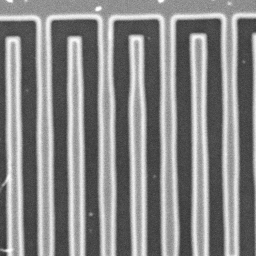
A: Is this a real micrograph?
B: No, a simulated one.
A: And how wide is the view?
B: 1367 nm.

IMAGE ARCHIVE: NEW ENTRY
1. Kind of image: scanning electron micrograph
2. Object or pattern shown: groups of lines, slits or small figures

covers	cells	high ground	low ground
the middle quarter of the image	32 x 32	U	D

DDUUDDDDDUUUDDDDDUUDDDDDDUUDDDDD
DDUUDDDDDUUUDDDDDUUDDDDDDUUDDDDD
DUUUDDDDDUUUDDDDDUUDDDDDDUUDDDDD
DUUUDDDDDUUUDDDDDUUDDDDDDUUDDDDD
DUUUDDDDDUUUDDDDDUUUDDDDDUUDDDDD
DUUUDDDDDUUUDDDDDUUUDDDDDUUDDDDD
DUUUDDDDDUUUDDDDDUUUDDDDDUUDDDDD
DUUUDDDDDUUUDDDDDUUUDDDDDUUUDDDD
DUUUDDDDDUUUDDDDDUUUDDDDDUUUDDDD
DUUUDDDDDUUUDDDDDUUUDDDDDUUUDDDD
DDUUDDDDDUUUDDDDDUUUDDDDDUUUDDDD
DDUUDDDDDUUUDDDDDUUUDDDDDUUUDDDD
DDUUDDDDDUUUDDDDDUUUDDDDDUUUDDDD
DDUUDDDDDUUUDDDDDUUUDDDDDUUUDDDD
DDUUDDDDDUUUDDDDDUUUDDDDDUUUDDDD
DDUUDDDDDUUUDDDDDUUUDDDDDUUUDDDD
DUUUDDDDDUUUDDDDDUUUDDDDDUUUDDDD
DUUUDDDDDUUUDDDDDUUUDDDDDUUUDDDD
DUUUDDDDDUUUDDDDDUUUDDDDDUUUDDDD
DUUUDDDDDUUUDDDDDUUUDDDDDUUUDDDD
DUUUUDDDDUUUDDDDDUUUDDDDDUUUDDDD
DUUUUDDDDUUUDDDDDUUUDDDDDUUUDDDD
DUUUUDDDDUUUDDDDDUUUDDDDDUUUDDDD
DDUUUDDDDUUUDDDDDUUUDDDDDUUUDDDD
DDUUUDDDDUUUDDDDDUUUDDDDDUUUDDDD
DDUUUDDDDUUUDDDDDUUUDDDDDUUUDDDD
DDUUUDDDDUUUDDDDDUUUDDDDDUUUDDDD
DDUUUDDDDUUUDDDDDUUUDDDDDUUUDDDD
DDUUUDDDDUUUDDDDDUUUDDDDDUUUDDDD
DDUUUDDDDUUUUDDDDUUUDDDDDUUUDDDD
DDUUUDDDDUUUUDDDDUUUDDDDDUUUDDDD
DDUUUDDDDUUUUDDDDUUUDDDDDUUUDDDD